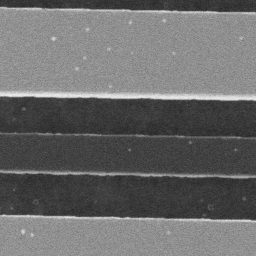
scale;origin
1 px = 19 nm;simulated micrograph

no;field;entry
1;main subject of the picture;lines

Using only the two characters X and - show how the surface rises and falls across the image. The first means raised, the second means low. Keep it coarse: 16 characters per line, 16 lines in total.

X---------------
XXXXXXXXXXXXXXXX
XXXXXXXXXXXXXXXX
XXXXXXXXXXXXXXXX
XXXXXXXXXXXXXXXX
XXXXXXXXXXXXXXXX
----------------
----------------
XXXXXXXXX-------
XXXXXXXXXXXXXXXX
XXXXXXXXXXXXXXXX
----------------
----------------
----------------
XXXXXXXXXXXXXXXX
XXXXXXXXXXXXXXXX